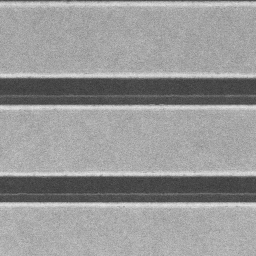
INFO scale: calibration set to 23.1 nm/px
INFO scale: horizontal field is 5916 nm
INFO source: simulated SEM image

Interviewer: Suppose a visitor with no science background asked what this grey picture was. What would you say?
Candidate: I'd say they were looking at lines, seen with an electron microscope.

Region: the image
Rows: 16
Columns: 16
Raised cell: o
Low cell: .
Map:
oooooooooooooooo
oooooooooooooooo
oooooooooooooooo
oooooooooooooooo
oooooooooooooooo
................
................
oooooooooooooooo
oooooooooooooooo
oooooooooooooooo
oooooooooooooooo
................
................
oooooooooooooooo
oooooooooooooooo
oooooooooooooooo